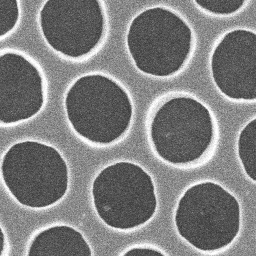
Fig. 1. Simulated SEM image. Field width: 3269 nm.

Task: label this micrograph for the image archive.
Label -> holes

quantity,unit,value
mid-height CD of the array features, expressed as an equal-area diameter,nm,855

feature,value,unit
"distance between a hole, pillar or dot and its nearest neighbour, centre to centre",1100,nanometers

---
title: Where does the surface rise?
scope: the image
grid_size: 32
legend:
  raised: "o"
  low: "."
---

..oooo.......oooooooooooo......o
..ooo........ooooo....oooo....oo
..ooo........oooo......ooooooooo
..ooo........ooo........oooooooo
oooooo.......ooo........oooo....
oooooo......oooo........ooo.....
ooooooo....ooooo........ooo.....
...oooooooooooooo......ooo......
....ooooooooooooo......ooo......
.....oooooo..ooooooo.oooooo.....
.....oooo......oooooooooooo.....
.....ooo........oooooooooooo....
.....ooo........oooo.....ooooooo
.....ooo.........oo.......oooooo
....oooo........ooo.......oooooo
ooooooooo.......ooo........oooo.
oooooooooo......ooo........ooo..
ooooooooooo....oooo........ooo..
o......oooooooooooo.......oooo..
........oooooooooooo......oooo..
........oooooo...oooo...oooooo..
........ooooo.....ooooooooooooo.
o.......oooo.......ooooooooooooo
o.......oooo.......ooooo....oooo
oo......oooo.......oooo......ooo
ooo...oooooo........oo........oo
oooooooooooo.......ooo........oo
ooooooooooooo.....oooo........oo
oooooo...ooooo..oooooo........oo
.oooo.....ooooooooooooo......ooo
.ooo.......ooooooooooooo....oooo
ooo........ooooo....oooooooooooo